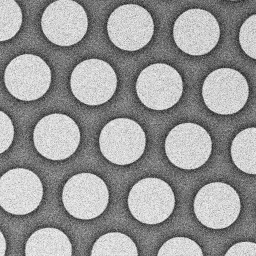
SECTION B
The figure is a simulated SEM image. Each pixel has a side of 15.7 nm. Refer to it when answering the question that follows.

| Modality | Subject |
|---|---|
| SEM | an array of small figures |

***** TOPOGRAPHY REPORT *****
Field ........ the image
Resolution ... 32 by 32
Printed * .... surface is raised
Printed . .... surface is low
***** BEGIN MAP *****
**....****......................
***...*****...****.....***......
***..******...*****...*****....*
**...******..******...*****...**
**....****....*****...*****...**
.......**.....****....*****...**
.......................***.....*
..***......*....................
.*****...*****....****..........
.*****...*****...*****....****..
.*****...******..******..******.
.*****...*****...******..******.
...*......***.....****....*****.
...................**.....****..
*.....**........................
*....****....****......*........
**..******...*****...*****....**
**..******..******...*****...***
*....*****...*****...*****...***
......***....*****...*****...***
...............*......***....***
.***...........................*
*****....****.....**............
*****...*****....****....****...
*****...*****...******...*****..
*****...*****...******..******..
.***.....****...*****...******..
.................***.....****...
...........................*....
....****.....***................
*..******...*****....****.....**
*..******..******...*****...****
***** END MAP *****